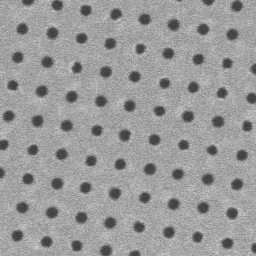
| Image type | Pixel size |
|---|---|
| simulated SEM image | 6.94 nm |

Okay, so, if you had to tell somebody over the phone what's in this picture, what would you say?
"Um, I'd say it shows a regular array of holes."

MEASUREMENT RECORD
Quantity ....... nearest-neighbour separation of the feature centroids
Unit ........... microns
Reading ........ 0.201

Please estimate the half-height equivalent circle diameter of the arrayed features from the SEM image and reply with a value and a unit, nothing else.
81.4 nanometers